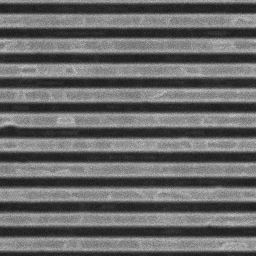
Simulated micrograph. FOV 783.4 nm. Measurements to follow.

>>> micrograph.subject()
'parallel lines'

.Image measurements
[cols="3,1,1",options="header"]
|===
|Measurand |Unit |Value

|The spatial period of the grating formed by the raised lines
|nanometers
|76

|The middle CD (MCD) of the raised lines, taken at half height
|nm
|43.2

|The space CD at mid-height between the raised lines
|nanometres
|34.8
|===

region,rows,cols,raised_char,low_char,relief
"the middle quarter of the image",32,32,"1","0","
11111111111111111111111111111111
11111111111111111111111111111111
11111111111111111111111111111111
00000000000000000000000000000000
00000000000000000000000000000000
00000000000000000000000000000000
11111111111111111111111111111111
11111111111111111111111111111111
11111111111111111111111111111111
00000000000000000000000000000000
00000000000000000000000000000000
00000000000000000000000000000000
00000000000000000000000000000111
11111111111111111111111111111111
11111111111111111111111111111111
11111111111111111111111111111111
00000000000000000000000000000000
00000000000000000000000000000000
00000000000000000000000000000000
11111111111111111111111111111111
11111111111111111111111111111111
11111111111111111111111111111111
00000000000000000000000000000000
00000000000000000000000000000000
00000000000000000000000000000000
11111111111111111111111111111111
11111111111111111111111111111111
11111111111111111111111111111111
00000000000000000000000000000000
00000000000000000000000000000000
00000000000000000000000000000000
11111111111111111111111111111111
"